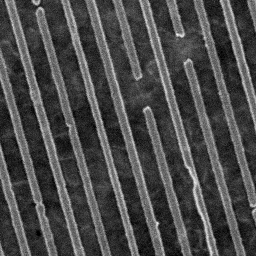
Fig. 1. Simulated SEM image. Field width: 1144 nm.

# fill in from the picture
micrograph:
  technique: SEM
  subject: parallel lines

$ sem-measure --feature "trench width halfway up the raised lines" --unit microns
0.0787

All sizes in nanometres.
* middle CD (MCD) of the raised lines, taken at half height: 35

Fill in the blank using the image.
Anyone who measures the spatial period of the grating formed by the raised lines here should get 25.9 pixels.